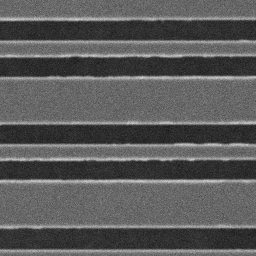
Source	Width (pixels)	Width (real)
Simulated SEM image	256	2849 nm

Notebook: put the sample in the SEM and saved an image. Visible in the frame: lines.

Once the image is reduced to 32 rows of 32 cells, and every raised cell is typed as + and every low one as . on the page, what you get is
++++++++++++++++++++++++++++++++
++++++++++++++++++++++++++++++++
+++++++++++++.+.................
................................
................................
++++++++++++++++++++++++++++++++
++++++++++++++++++++++++++++++++
................................
................................
................................
++++++++++++++++++++++++++++++++
++++++++++++++++++++++++++++++++
++++++++++++++++++++++++++++++++
++++++++++++++++++++++++++++++++
++++++++++++++++++++++++++++++++
................................
................................
................................
++++++++++++++++++++++++++++++++
++++++++++++++++++++++++++++++++
................................
................................
................................
++++++++++++++++++++++++++++++++
++++++++++++++++++++++++++++++++
++++++++++++++++++++++++++++++++
++++++++++++++++++++++++++++++++
++++++++++++++++++++++++++++++++
....+...........................
................................
................................
++++++++++++++++++++++++++++++++